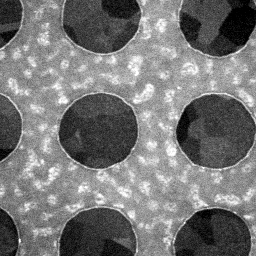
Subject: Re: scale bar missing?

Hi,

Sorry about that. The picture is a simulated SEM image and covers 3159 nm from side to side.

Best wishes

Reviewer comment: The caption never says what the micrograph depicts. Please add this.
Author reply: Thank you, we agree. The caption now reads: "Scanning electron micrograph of raised bodies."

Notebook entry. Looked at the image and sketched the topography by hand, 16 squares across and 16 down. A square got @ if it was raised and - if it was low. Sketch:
@---@@@@@--@@@@@
@---@@@@@--@@@@@
@---@@@@----@@@@
-------------@--
----------------
----------------
@---@@@@----@@@-
@---@@@@@--@@@@@
@---@@@@@--@@@@@
@---@@@@---@@@@@
------@------@--
----------------
----------------
@----@@@----@@@-
@---@@@@---@@@@@
@---@@@@@--@@@@@